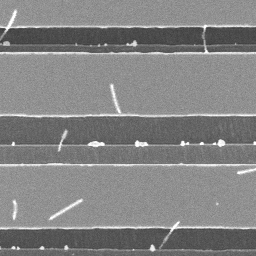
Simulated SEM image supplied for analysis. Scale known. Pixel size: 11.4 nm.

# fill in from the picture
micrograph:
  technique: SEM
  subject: lines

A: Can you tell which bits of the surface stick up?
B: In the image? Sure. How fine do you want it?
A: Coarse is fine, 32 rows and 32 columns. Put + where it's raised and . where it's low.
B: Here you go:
++++++++++++++++++++++++++++++++
++++++++++++++++++++++++++++++++
++++++++++++++++++++++++++++++++
++..............................
................................
................................
.........................+......
++++++++++++++++++++++++++++++++
++++++++++++++++++++++++++++++++
++++++++++++++++++++++++++++++++
++++++++++++++++++++++++++++++++
++++++++++++++++++++++++++++++++
++++++++++++++++++++++++++++++++
++++++++++++++++++++++++++++++++
...+++++++......................
................................
................................
................................
................................
................................
......+++.............+.........
++++++++++++++++++++++++++++++++
++++++++++++++++++++++++++++++++
++++++++++++++++++++++++++++++++
++++++++++++++++++++++++++++++++
++++++++++++++++++++++++++++++++
++++++++++++++++++++++++++++++++
++++++++++++++++++++++++++++++++
+.+++...+++..........+........+.
................................
................................
................................